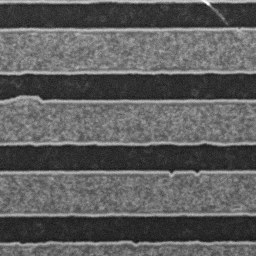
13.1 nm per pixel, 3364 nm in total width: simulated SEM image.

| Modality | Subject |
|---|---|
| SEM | one or a few lines or trenches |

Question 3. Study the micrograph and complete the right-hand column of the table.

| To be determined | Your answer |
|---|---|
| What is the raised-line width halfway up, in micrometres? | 0.552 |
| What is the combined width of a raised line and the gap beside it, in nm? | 936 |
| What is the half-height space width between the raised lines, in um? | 0.376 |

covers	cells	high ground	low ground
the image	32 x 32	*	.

................................
................................
................................
................................
********************************
********************************
********************************
********************************
********************************
................................
................................
................................
.****...........................
********************************
********************************
********************************
********************************
********************************
................................
................................
................................
................................
********************************
********************************
********************************
********************************
********************************
................................
................................
................................
.*...**************.************
********************************